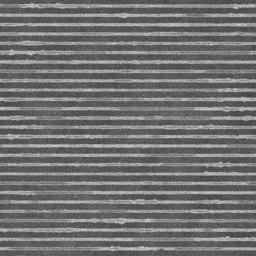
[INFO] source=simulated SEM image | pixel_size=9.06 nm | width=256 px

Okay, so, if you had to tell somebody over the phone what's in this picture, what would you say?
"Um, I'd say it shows parallel lines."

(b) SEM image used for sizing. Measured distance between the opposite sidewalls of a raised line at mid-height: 24.9 nm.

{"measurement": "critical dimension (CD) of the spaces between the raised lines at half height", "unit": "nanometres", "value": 61.2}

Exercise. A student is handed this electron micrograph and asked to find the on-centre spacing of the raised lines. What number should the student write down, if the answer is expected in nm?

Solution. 84.6